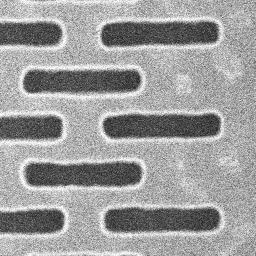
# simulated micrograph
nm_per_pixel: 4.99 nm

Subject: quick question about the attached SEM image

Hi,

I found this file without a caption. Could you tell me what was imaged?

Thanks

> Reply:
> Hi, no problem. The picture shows holes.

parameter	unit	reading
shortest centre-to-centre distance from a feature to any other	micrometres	0.453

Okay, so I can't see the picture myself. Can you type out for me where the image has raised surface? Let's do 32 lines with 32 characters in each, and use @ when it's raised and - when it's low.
@@@@@@@@@@@@@@@@@@@@@@@@@@@@@@@@
@@@@@@@@@@@@@@@@@@@@@@@@@@@@@@@@
@@@@@@@@@@@@@@@@@@@@@@@@@@@@@@@@
--------@@@@@--------------@@@@@
--------@@@@---------------@@@@@
-------@@@@@@--------------@@@@@
@@@@@@@@@@@@@@@@@@@@@@@@@@@@@@@@
@@@@@@@@@@@@@@@@@@@@@@@@@@@@@@@@
@@@@@@@@@@@@@@@@@@@@@@@@@@@@@@@@
@@@---------------@@@@@@@@@@@@@@
@@@---------------@@@@@@@@@@@@@@
@@@--------------@@@@@@@@@@@@@@@
@@@@@@@@@@@@@@@@@@@@@@@@@@@@@@@@
@@@@@@@@@@@@@@@@@@@@@@@@@@@@@@@@
-------@@@@@@@-------------@@@@@
--------@@@@@---------------@@@@
--------@@@@@--------------@@@@@
-------@@@@@@@@@@@@@@@@@@@@@@@@@
@@@@@@@@@@@@@@@@@@@@@@@@@@@@@@@@
@@@@@@@@@@@@@@@@@@@@@@@@@@@@@@@@
@@@--------------@@@@@@@@@@@@@@@
@@@---------------@@@@@@@@@@@@@@
@@@---------------@@@@@@@@@@@@@@
@@@@@@@@@@@@@@@@@@@@@@@@@@@@@@@@
@@@@@@@@@@@@@@@@@@@@@@@@@@@@@@@@
@@@@@@@@@@@@@@@@@@@@@@@@@@@@@@@@
--------@@@@@--------------@@@@@
--------@@@@@---------------@@@@
--------@@@@@--------------@@@@@
@@@@@@@@@@@@@@@@@@@@@@@@@@@@@@@@
@@@@@@@@@@@@@@@@@@@@@@@@@@@@@@@@
@@@@@@@@@@@@@@@@@@@@@@@@@@@@@@@@